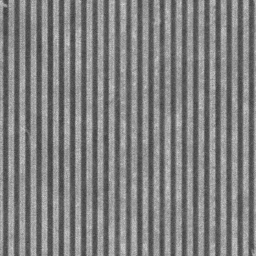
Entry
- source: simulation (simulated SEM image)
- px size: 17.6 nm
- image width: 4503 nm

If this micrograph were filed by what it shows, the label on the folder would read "parallel lines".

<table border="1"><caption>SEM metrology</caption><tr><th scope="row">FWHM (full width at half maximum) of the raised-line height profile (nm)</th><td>96.7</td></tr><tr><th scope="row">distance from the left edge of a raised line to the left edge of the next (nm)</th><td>196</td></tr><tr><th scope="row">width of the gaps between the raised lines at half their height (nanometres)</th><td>98.9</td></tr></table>